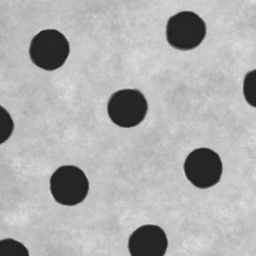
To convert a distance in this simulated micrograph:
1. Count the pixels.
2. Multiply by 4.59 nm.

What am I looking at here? holes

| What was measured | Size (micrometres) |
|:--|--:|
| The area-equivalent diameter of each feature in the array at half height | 0.178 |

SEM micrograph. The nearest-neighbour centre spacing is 444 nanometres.